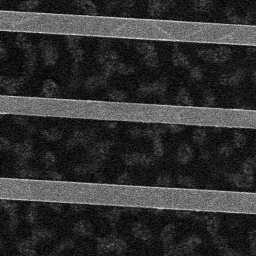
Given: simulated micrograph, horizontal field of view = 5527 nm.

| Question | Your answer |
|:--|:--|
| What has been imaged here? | one or a few lines or trenches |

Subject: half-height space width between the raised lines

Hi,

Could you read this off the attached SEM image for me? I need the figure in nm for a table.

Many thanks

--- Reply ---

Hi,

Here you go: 1390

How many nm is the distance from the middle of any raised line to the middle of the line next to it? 1810